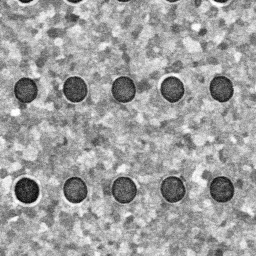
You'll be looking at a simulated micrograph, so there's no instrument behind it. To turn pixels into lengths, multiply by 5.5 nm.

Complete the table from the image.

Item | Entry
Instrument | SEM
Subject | a regular array of holes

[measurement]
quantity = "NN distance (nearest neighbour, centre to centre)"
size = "268 nanometres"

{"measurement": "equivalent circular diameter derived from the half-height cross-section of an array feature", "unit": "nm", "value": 143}